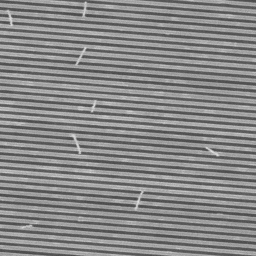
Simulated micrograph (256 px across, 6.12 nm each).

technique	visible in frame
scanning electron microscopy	parallel lines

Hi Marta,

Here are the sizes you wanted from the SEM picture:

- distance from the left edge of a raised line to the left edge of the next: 0.0422 µm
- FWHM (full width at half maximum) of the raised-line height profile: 21.3 nm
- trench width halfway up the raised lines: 0.0213 um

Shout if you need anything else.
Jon